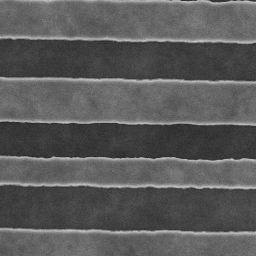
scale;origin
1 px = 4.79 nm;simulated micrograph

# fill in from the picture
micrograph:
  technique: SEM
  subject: lines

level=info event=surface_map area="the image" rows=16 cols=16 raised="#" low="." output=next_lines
################
################
.......#########
................
................
################
################
################
................
................
################
################
................
................
############....
################